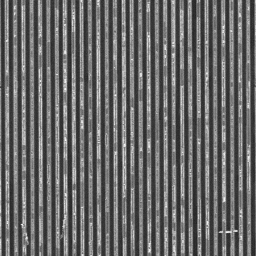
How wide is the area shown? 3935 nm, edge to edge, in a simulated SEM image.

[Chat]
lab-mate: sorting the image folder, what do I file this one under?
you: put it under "parallel lines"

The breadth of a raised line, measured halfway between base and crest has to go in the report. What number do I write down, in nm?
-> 46.1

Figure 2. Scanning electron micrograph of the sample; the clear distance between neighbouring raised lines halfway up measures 74.9 nanometers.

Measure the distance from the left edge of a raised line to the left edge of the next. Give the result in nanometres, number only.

128